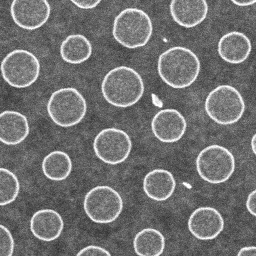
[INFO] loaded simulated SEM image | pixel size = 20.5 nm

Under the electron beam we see a regular array of raised bodies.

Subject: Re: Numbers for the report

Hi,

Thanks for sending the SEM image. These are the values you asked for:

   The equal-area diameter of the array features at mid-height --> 0.721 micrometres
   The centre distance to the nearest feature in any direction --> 1210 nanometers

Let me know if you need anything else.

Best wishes